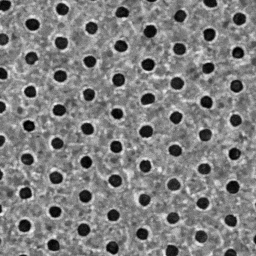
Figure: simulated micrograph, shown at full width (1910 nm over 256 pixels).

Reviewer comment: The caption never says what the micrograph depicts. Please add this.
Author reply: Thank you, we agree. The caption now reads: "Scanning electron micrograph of a regular array of holes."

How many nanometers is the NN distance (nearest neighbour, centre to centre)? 248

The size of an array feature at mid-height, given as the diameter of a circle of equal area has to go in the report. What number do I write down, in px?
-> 13.3